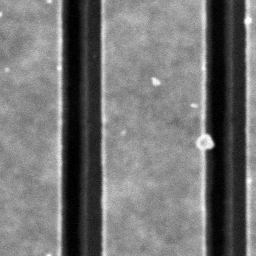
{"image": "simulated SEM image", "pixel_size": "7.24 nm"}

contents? lines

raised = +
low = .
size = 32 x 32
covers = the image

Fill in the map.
++++++++.....+++++++++++++.....+
++++++++.....+++++++++++++.....+
++++++++.....+++++++++++++.....+
++++++++.....+++++++++++++.....+
++++++++.....+++++++++++++.....+
++++++++.....+++++++++++++.....+
++++++++.....+++++++++++++.....+
++++++++.....+++++++++++++.....+
++++++++.....+++++++++++++.....+
++++++++.....+++++++++++++.....+
++++++++.....+++++++++++++.....+
++++++++.....+++++++++++++.....+
++++++++.....+++++++++++++.....+
++++++++.....+++++++++++++.....+
++++++++.....+++++++++++++.....+
++++++++.....+++++++++++++.....+
++++++++.....+++++++++++++.....+
++++++++.....+++++++++++++.....+
++++++++.....+++++++++++++.....+
++++++++.....+++++++++++++.....+
++++++++.....+++++++++++++.....+
++++++++.....+++++++++++++.....+
++++++++.....+++++++++++++.....+
++++++++.....+++++++++++++.....+
++++++++.....+++++++++++++.....+
++++++++.....+++++++++++++.....+
++++++++.....+++++++++++++.....+
++++++++.....+++++++++++++.....+
++++++++.....+++++++++++++.....+
++++++++.....+++++++++++++.....+
++++++++.....+++++++++++++.....+
++++++++.....+++++++++++++.....+